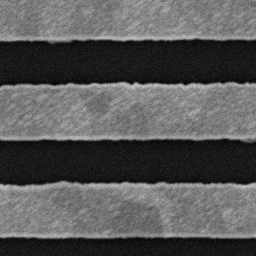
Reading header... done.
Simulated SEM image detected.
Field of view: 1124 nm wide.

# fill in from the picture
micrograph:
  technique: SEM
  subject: lines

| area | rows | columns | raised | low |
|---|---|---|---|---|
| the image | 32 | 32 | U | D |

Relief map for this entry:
UUUUUUUUUUUUUUUUUUUUUUUUUUUUUUUU
UUUUUUUUUUUUUUUUUUUUUUUUUUUUUUUU
UUUUUUUUUUUUUUUUUUUUUUUUUUUUUUUU
UUUUUUUUUUUUUUUUUUUUUUUUUUUUUUUU
UUUUUUUUUUUUUUUUUUUUUUUUUUUUUUUU
DDDDDDDDDDDDDDDDDDDDDDDDDDDDDDDD
DDDDDDDDDDDDDDDDDDDDDDDDDDDDDDDD
DDDDDDDDDDDDDDDDDDDDDDDDDDDDDDDD
DDDDDDDDDDDDDDDDDDDDDDDDDDDDDDDD
DDDDDDDDDDDDDDDDDDDDDDDDDDDDDDDD
DDDDDDDDUDDUDUUUUDUUDDUDUDUUUUUU
UUUUUUUUUUUUUUUUUUUUUUUUUUUUUUUU
UUUUUUUUUUUUUUUUUUUUUUUUUUUUUUUU
UUUUUUUUUUUUUUUUUUUUUUUUUUUUUUUU
UUUUUUUUUUUUUUUUUUUUUUUUUUUUUUUU
UUUUUUUUUUUUUUUUUUUUUUUUUUUUUUUU
UUUUUUUUUUUUUUUUUUUUUUUUUUUUUUUU
DDDDDDDDDDDDDDDDDDDDDDDDDDDDDDDD
DDDDDDDDDDDDDDDDDDDDDDDDDDDDDDDD
DDDDDDDDDDDDDDDDDDDDDDDDDDDDDDDD
DDDDDDDDDDDDDDDDDDDDDDDDDDDDDDDD
DDDDDDDDDDDDDDDDDDDDDDDDDDDDDDDD
DDDDDDDDDDDDDDDDDDDDDDDDDDDDDDDD
UUUUUUUUUUUUUUUUUUUUUUUUUUUUUUUU
UUUUUUUUUUUUUUUUUUUUUUUUUUUUUUUU
UUUUUUUUUUUUUUUUUUUUUUUUUUUUUUUU
UUUUUUUUUUUUUUUUUUUUUUUUUUUUUUUU
UUUUUUUUUUUUUUUUUUUUUUUUUUUUUUUU
UUUUUUUUUUUUUUUUUUUUUUUUUUUUUUUU
UUUUUUUUUUUUUUUUUUUUUUUUUUUUUUUU
DDDDDDDDDDDDDDDDDDDDDDDDDDDDDDDD
DDDDDDDDDDDDDDDDDDDDDDDDDDDDDDDD